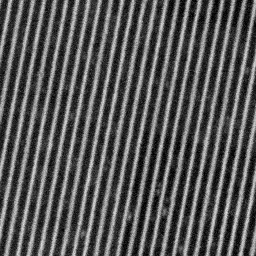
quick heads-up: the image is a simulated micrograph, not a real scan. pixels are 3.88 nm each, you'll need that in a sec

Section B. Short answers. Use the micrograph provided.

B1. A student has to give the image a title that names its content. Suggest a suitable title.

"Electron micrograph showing parallel lines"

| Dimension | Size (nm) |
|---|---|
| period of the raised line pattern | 42.5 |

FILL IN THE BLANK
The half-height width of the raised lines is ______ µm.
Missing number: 0.0104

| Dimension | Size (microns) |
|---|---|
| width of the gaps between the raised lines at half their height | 0.0309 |